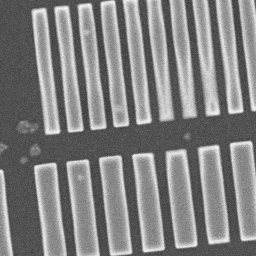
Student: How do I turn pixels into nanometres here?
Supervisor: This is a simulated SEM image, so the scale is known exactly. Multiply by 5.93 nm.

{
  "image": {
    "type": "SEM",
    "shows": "groups of lines, slits or small figures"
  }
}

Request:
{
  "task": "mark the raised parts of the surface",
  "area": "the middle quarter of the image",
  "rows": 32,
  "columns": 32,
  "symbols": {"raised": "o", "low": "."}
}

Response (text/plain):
oo...ooo...ooo...ooo...ooo...oo.
ooo...oo...oooo..ooo...ooo...ooo
ooo...ooo..oooo..ooo...ooo...ooo
ooo...ooo..oooo..ooo...ooo...ooo
ooo...ooo..oooo..ooo...ooo...ooo
ooo...ooo...ooo..oooo...oo...ooo
ooo...ooo...ooo..oooo...oo....oo
oooo..oooo..ooo...ooo...oo....oo
oooo..oooo..ooo...ooo...oo....oo
oooo..oooo..ooo...ooo...oo....oo
.ooo..oooo..oooo..ooo...oo....oo
.ooo..oooo..oooo..ooo...oo....oo
.ooo..oooo..oooo..ooo...ooo....o
.ooo..oooo..oooo..ooo....o......
.oooo..ooo..oooo..ooo...........
.oooo..ooo...oo.................
.ooo............................
................................
................................
................................
................................
................................
..........................oooo..
..........oooo...ooooo....oooo..
..oooo...ooooo...ooooo....ooooo.
.ooooo...ooooo....oooo....ooooo.
.ooooo...oooooo...ooooo...ooooo.
.ooooo...oooooo...ooooo...ooooo.
.ooooo....ooooo...ooooo...ooooo.
.oooooo...ooooo...ooooo...ooooo.
.oooooo...ooooo...ooooo...oooooo
..ooooo...ooooo....ooooo..oooooo